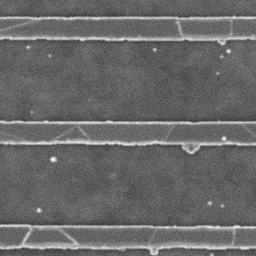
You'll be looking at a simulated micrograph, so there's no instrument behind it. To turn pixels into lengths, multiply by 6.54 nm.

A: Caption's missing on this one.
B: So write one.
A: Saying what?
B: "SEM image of lines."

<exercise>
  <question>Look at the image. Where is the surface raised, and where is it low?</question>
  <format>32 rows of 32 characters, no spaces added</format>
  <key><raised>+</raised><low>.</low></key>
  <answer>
................................
................................
++++++++++++++++++++++++++++++++
++++++++++++++++++++++++++++++++
++++++++++++++++++++++++++++++++
................................
................................
................................
................................
................................
................................
................................
................................
................................
................................
++++++++++++++++++++++++++++++++
++++++++++++++++++++++++++++++++
++++++++++++++++++++++++++++++++
................................
................................
................................
................................
................................
................................
................................
................................
................................
................................
++++++++++++++++++++++++++++++++
++++++++++++++++++++++++++++++++
++++++++++++++++++++++++++++++++
................................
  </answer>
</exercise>